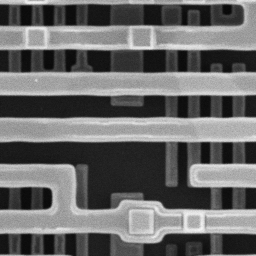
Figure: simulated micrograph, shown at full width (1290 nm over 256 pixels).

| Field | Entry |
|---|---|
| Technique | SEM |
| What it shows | wiring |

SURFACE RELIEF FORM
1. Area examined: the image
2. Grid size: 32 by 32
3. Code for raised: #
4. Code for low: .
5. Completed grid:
.#########...##....########..###
..............................##
..............................##
################################
################################
################################
................................
................................
................................
################################
################################
################################
................................
................................
................................
################################
################################
################################
................................
................................
................................
#########...............########
#########...............########
......###.......................
.......##.......................
......####.....#####............
################################
################################
################################
...............######...........
................................
................................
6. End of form